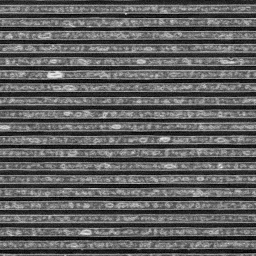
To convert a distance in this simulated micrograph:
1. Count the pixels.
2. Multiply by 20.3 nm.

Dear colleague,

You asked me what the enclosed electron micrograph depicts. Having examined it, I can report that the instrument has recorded parallel lines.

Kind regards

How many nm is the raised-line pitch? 266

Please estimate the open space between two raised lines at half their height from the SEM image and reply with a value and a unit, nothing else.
104 nm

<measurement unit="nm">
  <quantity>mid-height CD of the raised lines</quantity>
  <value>173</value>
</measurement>